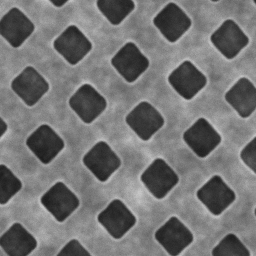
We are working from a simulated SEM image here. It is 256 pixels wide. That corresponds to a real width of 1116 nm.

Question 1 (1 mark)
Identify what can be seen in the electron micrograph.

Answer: a regular array of holes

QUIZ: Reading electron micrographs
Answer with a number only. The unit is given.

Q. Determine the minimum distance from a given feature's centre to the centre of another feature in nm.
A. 256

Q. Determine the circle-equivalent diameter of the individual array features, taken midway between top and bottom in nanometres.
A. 152